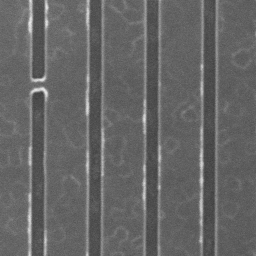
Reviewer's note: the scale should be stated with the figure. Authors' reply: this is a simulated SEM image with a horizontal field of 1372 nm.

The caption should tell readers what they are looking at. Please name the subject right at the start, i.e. parallel lines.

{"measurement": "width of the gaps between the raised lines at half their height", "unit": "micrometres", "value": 0.0691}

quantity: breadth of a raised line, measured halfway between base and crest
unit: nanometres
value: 236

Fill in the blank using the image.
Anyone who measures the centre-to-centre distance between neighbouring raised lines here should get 0.305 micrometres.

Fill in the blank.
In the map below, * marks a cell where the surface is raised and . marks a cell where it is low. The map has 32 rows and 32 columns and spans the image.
****..*****..*****..*****..*****
****..*****..*****..*****..*****
****..*****..*****..*****..*****
****..*****..*****..*****..*****
****..*****..*****..*****..*****
****..*****..*****..*****..*****
****..*****..*****..*****..*****
****..*****..*****..*****..*****
****..*****..*****..*****..*****
****.******..*****..*****..*****
***********..*****..*****..*****
***********..*****..*****..*****
****..*****..*****..*****..*****
****..*****..*****..*****..*****
****..*****..*****..*****..*****
****..*****..*****..*****..*****
****..*****..*****..*****..*****
****..*****..*****..*****..*****
****..*****..*****..*****..*****
****..*****..*****..*****..*****
****..*****..*****..*****..*****
****..*****..*****..*****..*****
****..*****..*****..*****..*****
****..*****..*****..*****..*****
****..*****..*****..*****..*****
****..*****..*****..*****..*****
****..*****..*****..*****..*****
****..*****..*****..*****..*****
****..*****..*****..*****..*****
****..*****..*****..*****..*****
****..*****..*****..*****..*****
****..*****..*****..*****..*****